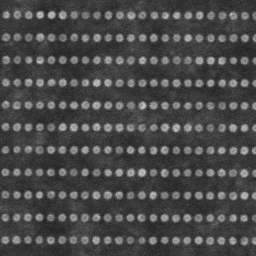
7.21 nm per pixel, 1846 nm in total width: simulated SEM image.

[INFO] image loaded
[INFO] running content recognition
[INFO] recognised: a regular array of raised bodies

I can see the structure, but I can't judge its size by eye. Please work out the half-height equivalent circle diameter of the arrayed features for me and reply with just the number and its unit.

48.1 nanometers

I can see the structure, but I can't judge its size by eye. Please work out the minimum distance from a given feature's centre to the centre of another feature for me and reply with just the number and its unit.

80.6 nm